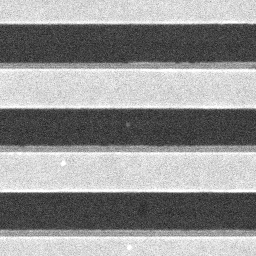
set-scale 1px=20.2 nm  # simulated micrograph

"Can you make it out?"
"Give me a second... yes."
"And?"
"lines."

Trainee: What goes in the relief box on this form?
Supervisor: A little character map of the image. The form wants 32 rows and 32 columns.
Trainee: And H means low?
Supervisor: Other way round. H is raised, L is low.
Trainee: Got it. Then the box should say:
HHHHHHHHHHHHHHHHHHHHHHHHHHHHHHHH
HHHHHHHHHHHHHHHHHHHHHHHHHHHHHHHH
HHHHHHHHHHHHHHHHHHHHHHHHHHHHHHHH
LLLLLLLLLLLLLLLLLLLLLLLLLLLLLLLL
LLLLLLLLLLLLLLLLLLLLLLLLLLLLLLLL
LLLLLLLLLLLLLLLLLLLLLLLLLLLLLLLL
LLLLLLLLLLLLLLLLLLLLLLLLLLLLLLLL
LLLLLLLLLLLLLLLLLLLLLLLLLLLLLLLL
LLLLLLLLLLLLLLLLLLLLLLLLLLLLLLLL
HHHHHHHHHHHHHHHHHHHHHHHHHHHHHHHH
HHHHHHHHHHHHHHHHHHHHHHHHHHHHHHHH
HHHHHHHHHHHHHHHHHHHHHHHHHHHHHHHH
HHHHHHHHHHHHHHHHHHHHHHHHHHHHHHHH
LLLLLLLHLLLLLLLLLLLLLLLLLHHHHHLH
LLLLLLLLLLLLLLLLLLLLLLLLLLLLLLLL
LLLLLLLLLLLLLLLLLLLLLLLLLLLLLLLL
LLLLLLLLLLLLLLLLLLLLLLLLLLLLLLLL
LLLLLLLLLLLLLLLLLLLLLLLLLLLLLLLL
LLLLLLLLLLLLLLLLLLLLLLLLLLLLLLLL
HHHHHHHHHHHHHHHHHHHHHHHHHHHHHHHH
HHHHHHHHHHHHHHHHHHHHHHHHHHHHHHHH
HHHHHHHHHHHHHHHHHHHHHHHHHHHHHHHH
HHHHHHHHHHHHHHHHHHHHHHHHHHHHHHHH
HHHHHHHHHHHHHHHHHHHHHHHHHHHHHHHH
LLLLLLLLLLLLLLLLLLLLLLLLLLLLLLLL
LLLLLLLLLLLLLLLLLLLLLLLLLLLLLLLL
LLLLLLLLLLLLLLLLLLLLLLLLLLLLLLLL
LLLLLLLLLLLLLLLLLLLLLLLLLLLLLLLL
LLLLLLLLLLLLLLLLLLLLLLLLLLLLLLLL
LLLLLLLLLLLLLLLLLLLLLLLLLLLLLLLL
HHHHHHHHHHHHHHHHHHHHHHHHHHHHHHHH
HHHHHHHHHHHHHHHHHHHHHHHHHHHHHHHH